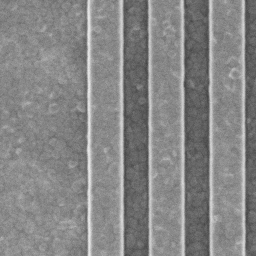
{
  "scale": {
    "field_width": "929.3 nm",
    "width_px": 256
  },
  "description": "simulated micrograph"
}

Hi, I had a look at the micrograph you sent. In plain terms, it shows parallel lines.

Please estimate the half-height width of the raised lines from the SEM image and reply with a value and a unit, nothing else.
129 nm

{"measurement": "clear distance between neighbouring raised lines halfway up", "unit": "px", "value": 25.4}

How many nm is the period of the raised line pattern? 221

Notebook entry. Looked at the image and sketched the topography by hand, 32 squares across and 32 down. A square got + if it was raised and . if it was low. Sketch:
...........++++....++++...+++++.
...........++++....++++...+++++.
...........++++....++++...+++++.
...........++++....++++...+++++.
...........++++....++++...+++++.
...........++++....++++...+++++.
...........++++....++++...+++++.
...........++++....++++...+++++.
...........++++....++++...+++++.
...........++++....++++...+++++.
...........++++....++++...+++++.
...........++++....++++...+++++.
...........++++....++++...+++++.
...........++++....++++...+++++.
...........++++....++++...+++++.
...........++++....++++...+++++.
...........++++....++++...+++++.
...........++++....++++...+++++.
...........++++....++++...+++++.
...........++++....++++...+++++.
...........++++....++++...+++++.
...........++++....++++...+++++.
...........++++....++++...+++++.
...........++++....++++...+++++.
...........++++....++++...+++++.
...........++++....++++...+++++.
...........++++....++++...+++++.
...........++++....++++...+++++.
...........++++....++++...+++++.
...........++++....++++...+++++.
...........++++....++++...+++++.
...........++++....++++...+++++.